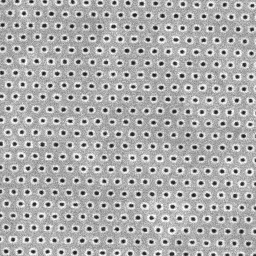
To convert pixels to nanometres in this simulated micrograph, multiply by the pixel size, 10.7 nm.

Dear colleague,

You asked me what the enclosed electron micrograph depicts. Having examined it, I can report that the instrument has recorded a regular array of holes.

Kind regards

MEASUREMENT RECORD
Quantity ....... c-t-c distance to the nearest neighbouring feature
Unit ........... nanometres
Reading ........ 142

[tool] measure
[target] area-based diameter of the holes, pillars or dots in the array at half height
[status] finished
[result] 57.6 nm